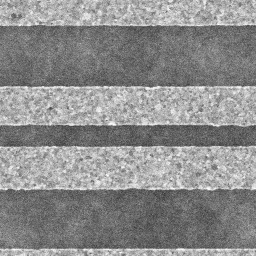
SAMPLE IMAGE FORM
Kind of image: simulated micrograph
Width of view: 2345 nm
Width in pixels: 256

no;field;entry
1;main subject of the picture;one or a few lines or trenches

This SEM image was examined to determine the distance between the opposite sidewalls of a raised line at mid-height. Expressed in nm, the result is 359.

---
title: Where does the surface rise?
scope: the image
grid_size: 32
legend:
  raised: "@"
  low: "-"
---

@@@@@@@@@@@@@@@@@@@@@@@@@@@@@@@@
@@@@@@@@@@@@@@@@@@@@@@@@@@@@@@@@
@@@@@@@@@@@@@@@@@@@@@@@@@@@@@@@@
--------------------------------
--------------------------------
--------------------------------
--------------------------------
--------------------------------
--------------------------------
--------------------------------
--------------------------------
@@@@@@@@@@@@@@@@@@@@@@@@@@@@@@@@
@@@@@@@@@@@@@@@@@@@@@@@@@@@@@@@@
@@@@@@@@@@@@@@@@@@@@@@@@@@@@@@@@
@@@@@@@@@@@@@@@@@@@@@@@@@@@@@@@@
@@@--@@@@@@@@@@@@@@@@@@@-@@@@@@@
--------------------------------
--------------------------------
@@@@@@@@@@--@@@@@@@@@@@@@@@@@@@@
@@@@@@@@@@@@@@@@@@@@@@@@@@@@@@@@
@@@@@@@@@@@@@@@@@@@@@@@@@@@@@@@@
@@@@@@@@@@@@@@@@@@@@@@@@@@@@@@@@
@@@@@@@@@@@@@@@@@@@@@@@@@@@@@@@@
@@@@@@@@@@@@@@@@-@@@@@@@@@@@@@@@
--------------------------------
--------------------------------
--------------------------------
--------------------------------
--------------------------------
--------------------------------
--------------------------------
@@@@@@@@@@@@@@@@@@@@@@@@@@@@@@@@